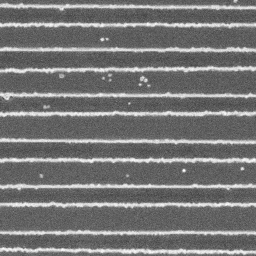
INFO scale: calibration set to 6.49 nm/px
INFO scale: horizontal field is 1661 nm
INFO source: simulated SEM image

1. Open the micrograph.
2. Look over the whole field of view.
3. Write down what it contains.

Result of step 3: lines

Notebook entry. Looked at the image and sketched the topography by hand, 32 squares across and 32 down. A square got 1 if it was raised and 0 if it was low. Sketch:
11111111111111111111111111111111
00000000000000000000000000000000
00000000000000000000000000000000
11111111111111111111111111111111
11111111111111111111111111111111
11111111111111111111111111111111
00000000000000000000000000000000
00000000000000000000000000000000
00000000000000000000000000100111
11111111111111111111111111111111
11111111111111111111111111111111
11111111111111111111111111111111
00000000000000000000000000000000
00000000000000000000000000000000
11111111111111111111111111111111
11111111111111111111111111111111
11111111111111111111111111111111
11111111111111111111111111111111
00000000000000000000000000000000
00000000000000000000000000000000
11111111111111111111111111111111
11111111111111111111111111111111
11111111111111111111111111111111
00000000000000000000000000000000
00000000000000000000000000000000
01010010000101000000110000001001
11111111111111111111111111111111
11111111111111111111111111111111
11111111111111111111111111111111
00000000000000000000000000000000
00000000000000000000000000000000
11111111111111111111111111111111